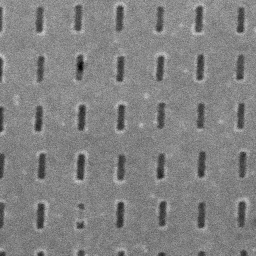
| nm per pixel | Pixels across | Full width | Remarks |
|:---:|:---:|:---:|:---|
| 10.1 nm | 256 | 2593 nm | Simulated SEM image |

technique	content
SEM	a regular array of holes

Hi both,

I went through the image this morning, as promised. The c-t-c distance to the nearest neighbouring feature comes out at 403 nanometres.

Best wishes